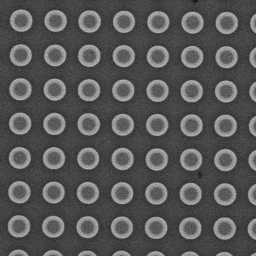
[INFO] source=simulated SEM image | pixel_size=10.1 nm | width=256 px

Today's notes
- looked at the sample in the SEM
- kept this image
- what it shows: an array of small figures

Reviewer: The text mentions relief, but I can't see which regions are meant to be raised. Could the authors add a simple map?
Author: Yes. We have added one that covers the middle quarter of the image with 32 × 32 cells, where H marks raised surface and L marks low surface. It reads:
LLLLLHHLLLLLLLHHLLLLLLHHHLLLLLLH
LLLLLLLLLLLLLLLLLLLLLLLLLLLLLLLL
LLLLLLLLLLLLLLLLLLLLLLLLLLLLLLLL
LLLLLLLLLLLLLLLLLLLLLLLLLLLLLLLL
LLLLHHHHLLLLLHHHHLLLLLHHHLLLLLHH
LLLLHHHHHLLLHHHHHLLLLHHHHHLLLLHH
LLLLHHHHHLLLHHHHHLLLLHHHHHLLLHHH
LLLLHHHHHLLLHHHHHLLLLHHHHHLLLHHH
LLLLHHHHLLLLLHHHHLLLLHHHHLLLLLHH
LLLLLLLLLLLLLLLLLLLLLLLLLLLLLLLL
LLLLLLLLLLLLLLLLLLLLLLLLLLLLLLLL
LLLLLLLLLLLLLLLLLLLLLLLLLLLLLLLL
LLLLLHHLLLLLLLLLLLLLLLLLLLLLLLLL
LLLLHHHHLLLLLHHHHLLLLHHHHLLLLLHH
LLLLHHHHHLLLHHHHHLLLLHHHHHLLLHHH
LLLLHHHHHLLLHHHHHLLLLHHHHHLLLHHH
LLLLHHHHLLLLHHHHHLLLLHHHHHLLLHHH
LLLLLHHLLLLLLHHHLLLLLLHHHLLLLLHH
LLLLLLLLLLLLLLLLLLLLLLLLLLLLLLLL
LLLLLLLLLLLLLLLLLLLLLLLLLLLLLLLL
LLLLLLLLLLLLLLLLLLLLLLLLLLLLLLLL
LLLLHHHHLLLLLHHHLLLLLLHHHLLLLLLH
LLLLHHHHLLLLHHHHHLLLLHHHHHLLLHHH
LLLHHHHHHLLLHHHHHLLLLHHHHHLLLHHH
LLLLHHHHHLLLHHHHHLLLLHHHHHLLLHHH
LLLLHHHHLLLLLHHHHLLLLHHHHLLLLLHH
LLLLLLLLLLLLLLLLLLLLLLHHLLLLLLLH
LLLLLLLLLLLLLLLLLLLLLLLLLLLLLLLL
LLLLLLLLLLLLLLLLLLLLLLLLLLLLLLLL
LLLLLLLLLLLLLLLLLLLLLLLLLLLLLLLL
LLLLHHHHLLLLLHHHLLLLLHHHHLLLLLHH
LLLHHHHHHLLLHHHHHLLLLHHHHHLLLHHH